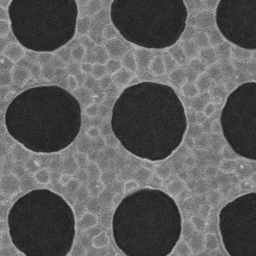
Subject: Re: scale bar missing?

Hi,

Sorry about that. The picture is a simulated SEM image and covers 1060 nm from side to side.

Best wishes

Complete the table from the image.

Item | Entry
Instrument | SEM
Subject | holes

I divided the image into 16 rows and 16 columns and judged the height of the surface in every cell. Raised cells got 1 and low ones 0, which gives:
1000011000001100
1000011000001100
1000111100011100
1111111111111111
1111111111111111
1100111100011110
1000011000011100
0000011000001100
1000011000011100
1101111100011110
1111111111111111
1111111111111111
1000111100011110
1000011000011100
1000011000011100
1000111000011100